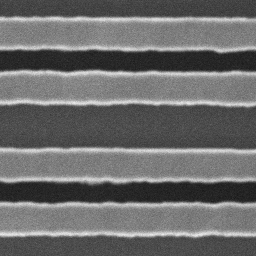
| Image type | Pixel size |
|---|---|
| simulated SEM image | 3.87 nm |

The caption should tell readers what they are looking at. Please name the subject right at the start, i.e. lines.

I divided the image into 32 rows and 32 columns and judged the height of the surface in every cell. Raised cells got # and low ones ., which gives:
................................
................................
################################
################################
################################
################################
...........................#....
................................
................................
################################
################################
################################
################################
................................
................................
................................
................................
................................
................................
################################
################################
################################
################################
................................
................................
######.#########################
################################
################################
################################
................#.......#.......
................................
................................